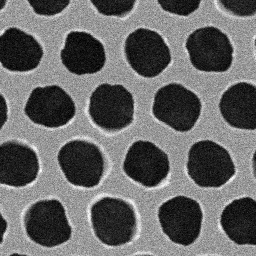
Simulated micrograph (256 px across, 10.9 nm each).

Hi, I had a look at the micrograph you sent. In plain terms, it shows a regular array of holes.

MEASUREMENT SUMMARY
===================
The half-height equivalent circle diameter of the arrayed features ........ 0.511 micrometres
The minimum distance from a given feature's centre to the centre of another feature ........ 681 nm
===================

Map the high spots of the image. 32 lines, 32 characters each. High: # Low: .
.###.....###.....###.....###....
####....####....#####...#####...
################################
#.###############.#######..#####
....####....####....####....####
.....###.....###.....##......###
.....###.....###.....##......###
.....###.....###.....###.....###
#...####.....####....###.....###
##################..############
#############.#######.#######..#
####....####....####....####....
.##......##......##......###....
.##.......#......##......##.....
.##......##......##......###....
.####...####....#####...#####...
################################
#########################.######
....####....####....####....####
.....##......###.....###.....###
.....##......##......##......###
.....###.....###.....###.....###
....####....#####...####.....###
################################
######################.#########
####....####....####.....####...
###.....###......###.....###....
.##.....###......###.....###....
.##......##......###.....###....
####.....###.....####....###....
#####...#####...######..######..
################################